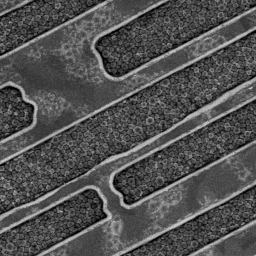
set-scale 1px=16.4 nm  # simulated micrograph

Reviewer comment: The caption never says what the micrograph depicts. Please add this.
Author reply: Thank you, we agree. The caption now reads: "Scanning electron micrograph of one or a few lines or trenches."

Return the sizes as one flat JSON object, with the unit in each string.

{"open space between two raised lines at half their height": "691 nm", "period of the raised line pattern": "1050 nm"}